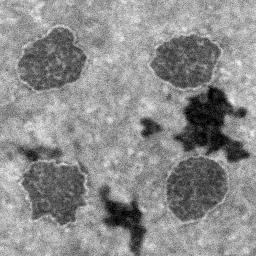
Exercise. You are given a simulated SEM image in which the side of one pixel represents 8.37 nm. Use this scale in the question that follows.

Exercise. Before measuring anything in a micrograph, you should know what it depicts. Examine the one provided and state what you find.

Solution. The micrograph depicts raised bodies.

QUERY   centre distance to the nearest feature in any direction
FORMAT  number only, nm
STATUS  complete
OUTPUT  1080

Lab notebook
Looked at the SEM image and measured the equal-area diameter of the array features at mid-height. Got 542 nanometres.